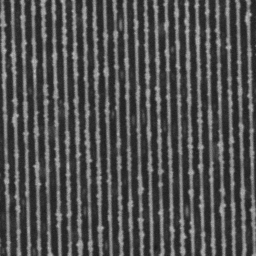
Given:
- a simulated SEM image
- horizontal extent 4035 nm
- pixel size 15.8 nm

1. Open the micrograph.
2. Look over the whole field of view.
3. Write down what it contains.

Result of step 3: parallel lines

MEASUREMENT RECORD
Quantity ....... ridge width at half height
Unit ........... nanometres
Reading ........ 45.3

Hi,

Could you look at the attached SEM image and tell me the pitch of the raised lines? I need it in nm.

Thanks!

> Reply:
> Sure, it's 161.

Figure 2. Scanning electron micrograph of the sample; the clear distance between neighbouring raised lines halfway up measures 0.116 µm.